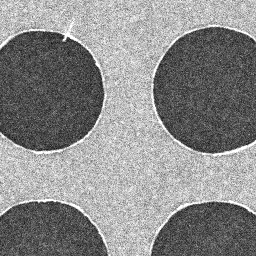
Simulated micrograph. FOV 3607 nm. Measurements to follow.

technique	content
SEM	holes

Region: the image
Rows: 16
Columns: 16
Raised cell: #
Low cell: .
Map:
################
################
#....######.....
......####......
......####......
......####......
......####......
......####......
.....######.....
#############.##
################
################
################
.....######.....
......####......
.......##.......